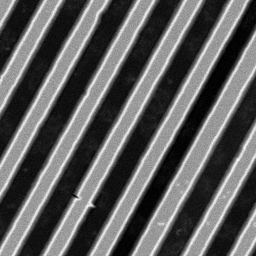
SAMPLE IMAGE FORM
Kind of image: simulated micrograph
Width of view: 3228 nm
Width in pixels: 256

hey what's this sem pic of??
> parallel lines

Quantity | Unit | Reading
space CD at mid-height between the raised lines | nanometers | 287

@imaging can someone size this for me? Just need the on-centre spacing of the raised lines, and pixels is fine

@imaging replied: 40.7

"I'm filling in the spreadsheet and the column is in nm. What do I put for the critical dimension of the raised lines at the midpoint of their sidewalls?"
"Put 232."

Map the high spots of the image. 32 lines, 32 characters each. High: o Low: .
oo...ooo...oo....oo....oo...ooo.
o....oo...ooo...ooo...ooo...ooo.
o...ooo...oo....oo....oo...ooo..
...ooo...ooo...ooo...ooo...oo...
...oo....oo....oo...ooo...ooo..o
..ooo...ooo...ooo...oo....oo...o
..oo....oo...ooo...ooo...ooo..oo
.ooo...ooo...oo....oo....oo...oo
.oo....oo...ooo...ooo...ooo..ooo
ooo...ooo...oo....oo....oo...ooo
oo...ooo...ooo...ooo...oo...ooo.
o....oo....oo....oo...ooo...oo..
o...ooo...ooo...ooo...oo...ooo..
o...oo....oo...ooo...ooo..ooo...
...ooo...ooo...oo....oo...ooo...
...oo....oo...ooo...ooo..ooo....
..ooo...ooo...oo....oo...ooo...o
..oo...ooo...ooo...ooo..ooo....o
.ooo...oo....oo....oo...ooo...oo
ooo...ooo...ooo...oo...ooo....oo
oo....oo....oo...ooo...ooo...ooo
oo...ooo...ooo...oo...ooo....oo.
o....oo...ooo...ooo..ooo....ooo.
o...ooo...oo....oo...ooo...ooo..
....oo...ooo...ooo..ooo....oo...
...ooo...ooo...oo...ooo...ooo...
..ooo...ooo...ooo..ooo....oo....
..oo....oo....oo...ooo...ooo...o
.ooo...ooo...ooo..ooo....oo...oo
.oo....oo...ooo...ooo...ooo...oo
ooo...ooo...oo...ooo....oo...ooo
oo....oo...ooo...ooo...ooo...oo.